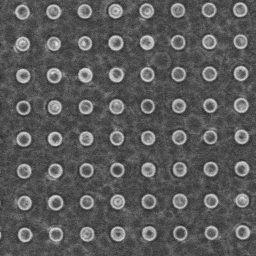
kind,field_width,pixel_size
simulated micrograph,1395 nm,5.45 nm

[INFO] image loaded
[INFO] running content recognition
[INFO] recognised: a regular array of raised bodies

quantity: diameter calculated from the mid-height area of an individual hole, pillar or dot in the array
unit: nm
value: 72.3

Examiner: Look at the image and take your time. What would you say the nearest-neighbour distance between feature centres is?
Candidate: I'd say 168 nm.